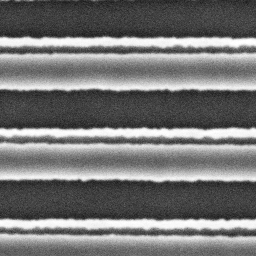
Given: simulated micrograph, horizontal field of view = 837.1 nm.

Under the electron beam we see lines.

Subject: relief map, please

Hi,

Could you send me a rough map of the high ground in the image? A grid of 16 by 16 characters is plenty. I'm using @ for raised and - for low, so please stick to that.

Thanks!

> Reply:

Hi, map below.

----------------
----------------
@@@@@@@@@@@@@@@@
@@@@@@@@@@@@@@@@
@@@@@@@@@@@@@@@@
@@@@@-@@@@@@@@@@
----------------
----------------
@@@@@@@@@@@@@@@@
@@@@@@@@@@@@@@@@
@@@@@@@@@@@@@@@@
----------------
----------------
----------------
@@@@@@@@@@@@@@@@
@@@@@@@@@@@@@@@@